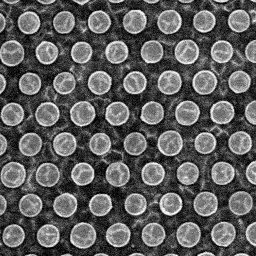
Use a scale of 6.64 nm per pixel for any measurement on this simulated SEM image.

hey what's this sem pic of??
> a regular array of raised bodies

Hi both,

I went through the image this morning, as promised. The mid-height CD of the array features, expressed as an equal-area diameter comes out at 148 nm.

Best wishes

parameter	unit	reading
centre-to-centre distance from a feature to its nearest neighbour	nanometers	230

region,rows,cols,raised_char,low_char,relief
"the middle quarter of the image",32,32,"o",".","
................................
................................
oo.....ooo......ooo......ooo....
oo....oooooo...ooooo....ooooo...
ooo...oooooo...ooooo....ooooo...
ooo...oooooo...ooooo....ooooo...
oo.....oooo.....oooo....oooo....
................................
................................
.....................o........oo
..ooooo....oooo.....oooo.....ooo
..oooooo...ooooo....ooooo...oooo
..oooooo...ooooo...oooooo...oooo
..oooooo...ooooo...oooooo...oooo
...oooo....oooo.....oooo.....ooo
....o...........................
................................
oo......oo.......oo......oooo...
ooo....oooo.....oooo....ooooo...
ooo....oooo....ooooo....ooooo...
ooo....oooo....ooooo....ooooo...
ooo....oooo.....oooo....ooooo...
oo......oo.......oo......ooo....
................................
................................
...ooo.....ooooo....oooo.....ooo
..ooooo....ooooo....ooooo...oooo
..ooooo....ooooo....ooooo...oooo
..ooooo....ooooo....ooooo...oooo
...ooo.....ooooo....oooo.....ooo
................................
................................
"